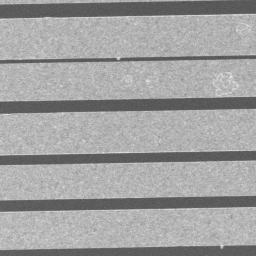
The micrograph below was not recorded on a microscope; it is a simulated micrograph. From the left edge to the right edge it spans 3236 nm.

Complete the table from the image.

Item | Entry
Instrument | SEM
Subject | parallel lines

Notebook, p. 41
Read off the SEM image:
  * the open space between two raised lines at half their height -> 153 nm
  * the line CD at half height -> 37.5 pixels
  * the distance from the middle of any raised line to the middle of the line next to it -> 0.606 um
